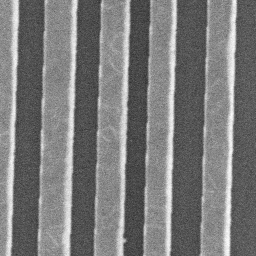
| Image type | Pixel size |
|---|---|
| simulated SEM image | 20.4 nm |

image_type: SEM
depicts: lines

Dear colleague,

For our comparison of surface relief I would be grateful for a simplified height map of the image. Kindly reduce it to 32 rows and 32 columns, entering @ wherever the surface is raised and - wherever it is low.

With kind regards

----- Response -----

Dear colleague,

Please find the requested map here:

@@----@@@----@@@---@@@----@@@---
@@----@@@----@@@---@@@----@@@---
@@----@@@----@@@---@@@----@@@---
@@----@@@----@@@---@@@----@@@---
@@----@@@----@@@---@@@----@@@---
@@----@@@----@@@---@@@----@@@---
@@----@@@----@@@---@@@----@@@---
@@----@@@----@@@---@@@----@@@---
@@---@@@@---@@@@---@@@----@@@---
@@---@@@@---@@@@---@@@----@@@---
@@---@@@@---@@@@---@@@----@@@---
@@---@@@@---@@@@---@@@----@@@---
@@---@@@@---@@@@---@@@----@@@---
@@---@@@@---@@@@---@@@----@@@---
@@---@@@@---@@@@---@@@----@@@---
@@---@@@@---@@@@--@@@@----@@@---
@@---@@@@---@@@@--@@@@----@@@---
@@---@@@@---@@@@--@@@-----@@@---
@@---@@@@---@@@@--@@@-----@@@---
@@---@@@@---@@@---@@@-----@@@---
@@---@@@@---@@@---@@@----@@@@---
@@---@@@@---@@@---@@@----@@@@---
@----@@@@---@@@---@@@----@@@@---
@----@@@@---@@@---@@@----@@@@---
@----@@@@---@@@---@@@----@@@@---
@----@@@@---@@@---@@@----@@@@---
@----@@@@---@@@---@@@----@@@@---
@----@@@@---@@@---@@@----@@@@---
@----@@@@---@@@---@@@----@@@@---
@----@@@@---@@@---@@@----@@@@---
@----@@@----@@@---@@@----@@@----
@----@@@----@@@---@@@----@@@----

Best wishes